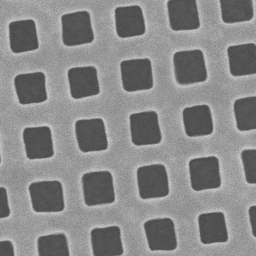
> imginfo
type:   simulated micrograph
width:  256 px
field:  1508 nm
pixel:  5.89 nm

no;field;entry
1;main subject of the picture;a regular array of holes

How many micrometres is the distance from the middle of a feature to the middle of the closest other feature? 0.311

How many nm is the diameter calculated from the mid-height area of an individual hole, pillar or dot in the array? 200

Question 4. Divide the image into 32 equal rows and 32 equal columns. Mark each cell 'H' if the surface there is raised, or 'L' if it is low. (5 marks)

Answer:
HHHHHHHHHHHHHHHHHHHHHLLLLHHHLLLL
HHHHHHHHHHLHHHLLLLHHHLLLLHHHLLLL
HHHLHHHHLLLHHHLLLLHHHLLLLHHHLLLH
HLLLHHHHLLLHHHHLLLHHHHLLLHHHHHHH
HLLLLHHHLLLLHHHLLHHHHHHHHHHHHHHH
HLLLLHHHLLHHHHHHHHHHHHHHHHHHHHHL
HHLHHHHHHHHHHHHHHHHHHHLLLHHHLLLL
HHHHHHHHHHHHHHHHLLLHHHLLLLHHHLLL
HHHHHHHHHLLLHHHLLLLHHHLLLLHHHLLL
HHLLLLHHHLLLHHHLLLLHHHLLLLHHHHHH
HHLLLLHHHLLLHHHLLLLHHHHHHHHHHHHH
HHLLLLHHHLLLHHHHHHHHHHHHHHHHHHHH
HHLLLLHHHHHHHHHHHHHHHHHHHHHHHHLL
HHHHHHHHHHHHHHHHHHHHHHHLLLHHHLLL
HHHHHHHHHHHHHHHHLLLLHHHLLLHHHLLL
HHHHHHHHHHLLLHHHLLLLHHHLLLLHHHLL
HHHLLLHHHHLLLHHHLLLLHHHLLLHHHHHH
HHHLLLLHHHLLLHHHHLLLHHHHHHHHHHHH
HHHLLLLHHHLLLHHHHHHHHHHHHHHHHHHH
HHHLLLHHHHHHHHHHHHHHHHHHHHHHHHLL
HHHHHHHHHHHHHHHHHHHHHHHHLLLHHHLL
HHHHHHHHHHHHLLHHHLLLLHHHLLLHHHHL
HHHHHHHHHHLLLLHHHLLLLHHHLLLLHHHL
HHHHLLLLHHLLLLHHHLLLLHHHLLLHHHHH
LHHHLLLLHHHLLLHHHHLLLHHHHHHHHHHH
LHHHLLLLHHHLHHHHHHHHHHHHHHHHHHHH
LHHHHHHHHHHHHHHHHHHHHHHHHHHHHHHL
HHHHHHHHHHHHHHHHHHHLLHHHHLLLHHHL
HHHHHHHHHHHHHLLHHHLLLLHHHLLLHHHL
HHHHHLLLHHHLLLLHHHLLLLHHHLLLHHHH
LHHHHLLLHHHLLLLHHHHLLLHHHHHHHHHH
LLHHHLLLLHHHLLLHHHHHHHHHHHHHHHHH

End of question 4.